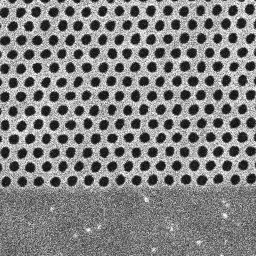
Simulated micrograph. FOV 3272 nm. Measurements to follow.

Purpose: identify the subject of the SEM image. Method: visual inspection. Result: a regular array of holes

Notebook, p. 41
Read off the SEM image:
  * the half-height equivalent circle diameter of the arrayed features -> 138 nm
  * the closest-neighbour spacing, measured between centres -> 200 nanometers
